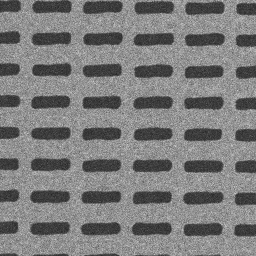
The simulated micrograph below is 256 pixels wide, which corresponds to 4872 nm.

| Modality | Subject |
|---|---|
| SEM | a regular array of holes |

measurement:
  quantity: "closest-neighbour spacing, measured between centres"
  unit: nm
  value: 597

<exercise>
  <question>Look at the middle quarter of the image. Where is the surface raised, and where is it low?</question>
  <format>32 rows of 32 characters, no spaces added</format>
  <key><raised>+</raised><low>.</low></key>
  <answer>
..+++.........+++++........+++++
..+++..........+++.........+++..
..+++.........++++.........+++..
+++++++++++++++++++..++++++++++.
++++++++++++++++++++++++++++++++
++++++++++++++++++++++++++++++++
++++++++++++++++++++++++++++++++
++++++++++++++++++++++++++++++++
.++++.........++++.........++++.
..++...........++..........+++..
.++++.........+++..........+++..
++++++++++++++++++.+++++++++++++
++++++++++++++++++++++++++++++++
++++++++++++++++++++++++++++++++
++++++++++++++++++++++++++++++++
++++++++++++++++++++++++++++++++
..+++.........++++.........++++.
..++..........+++..........+++..
.++++.........++++.........+++..
++++++++++++++++++++++++++++++++
++++++++++++++++++++++++++++++++
++++++++++++++++++++++++++++++++
++++++++++++++++++++++++++++++++
++++++++++++++++++++++++++++++++
..+++.........++++.........+++..
..+++.........+++..........+++..
.++++.........+++..........+++..
++++++++++++++++++++++++++++++++
++++++++++++++++++++++++++++++++
++++++++++++++++++++++++++++++++
++++++++++++++++++++++++++++++++
++++++++++++++++++++++++++++++++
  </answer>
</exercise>